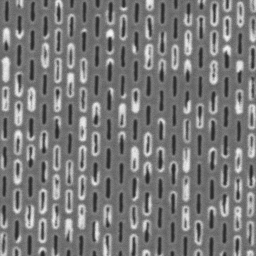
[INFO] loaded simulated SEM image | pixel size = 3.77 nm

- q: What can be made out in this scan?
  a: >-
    a regular array of holes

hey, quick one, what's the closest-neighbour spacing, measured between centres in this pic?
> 70.5 nanometers